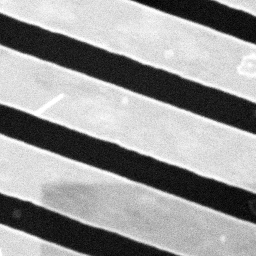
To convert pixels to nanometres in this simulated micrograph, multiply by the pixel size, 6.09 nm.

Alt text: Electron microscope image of lines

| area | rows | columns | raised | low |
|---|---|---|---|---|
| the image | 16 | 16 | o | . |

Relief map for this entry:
ooooooooo......o
..oooooooooo....
.....oooooooooo.
oo......oooooooo
ooooo......ooooo
oooooooo.....ooo
oooooooooo......
...oooooooooo...
......oooooooooo
ooo......ooooooo
oooooo.....ooooo
ooooooooo.....oo
..oooooooooo....
....oooooooooo..
o......ooooooooo
oooo......oooooo